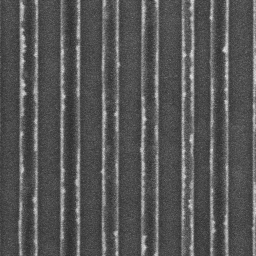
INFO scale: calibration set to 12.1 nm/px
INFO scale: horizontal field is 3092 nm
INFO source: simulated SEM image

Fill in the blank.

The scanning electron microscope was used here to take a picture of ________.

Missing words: parallel lines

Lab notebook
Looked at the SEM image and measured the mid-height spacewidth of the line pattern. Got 278 nm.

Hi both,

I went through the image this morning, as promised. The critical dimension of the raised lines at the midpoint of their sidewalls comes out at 205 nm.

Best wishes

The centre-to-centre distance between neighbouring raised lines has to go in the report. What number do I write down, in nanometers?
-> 460